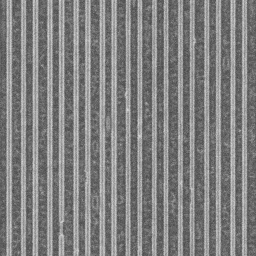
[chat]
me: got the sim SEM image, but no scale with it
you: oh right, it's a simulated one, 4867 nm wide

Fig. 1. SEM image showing parallel lines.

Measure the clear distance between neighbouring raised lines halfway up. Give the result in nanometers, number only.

183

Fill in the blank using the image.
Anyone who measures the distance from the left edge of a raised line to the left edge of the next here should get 249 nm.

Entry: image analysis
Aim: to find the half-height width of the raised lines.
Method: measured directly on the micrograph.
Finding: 73.7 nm